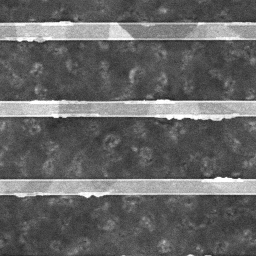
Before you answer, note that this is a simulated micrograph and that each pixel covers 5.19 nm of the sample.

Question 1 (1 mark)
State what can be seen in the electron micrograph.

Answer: one or a few lines or trenches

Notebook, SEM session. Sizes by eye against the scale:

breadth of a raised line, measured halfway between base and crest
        82.4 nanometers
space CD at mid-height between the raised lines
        324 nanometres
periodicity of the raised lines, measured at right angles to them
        405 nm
